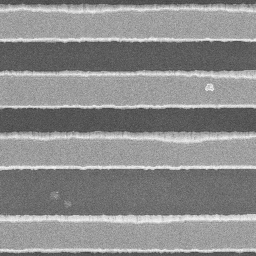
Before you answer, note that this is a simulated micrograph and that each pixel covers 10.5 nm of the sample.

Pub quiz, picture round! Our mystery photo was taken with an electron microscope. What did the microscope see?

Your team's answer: lines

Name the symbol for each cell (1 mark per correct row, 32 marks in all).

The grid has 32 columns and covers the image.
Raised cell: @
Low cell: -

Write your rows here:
--------------------------------
@@@@@@@@@@@@@@@@@@@@@@@@@@@@@@@@
@@@@@@@@@@@@@@@@@@@@@@@@@@@@@@@@
@@@@@@@@@@@@@@@@@@@@@@@@@@@@@@@@
@@@@@@@@@@@@@@@@@@@@@@@@@@@@@@@@
--------------------------------
--------------------------------
--------------------------------
--------------------------------
@@@@@@@@@@@@@@@@@@@@@@@@@@@@@@@@
@@@@@@@@@@@@@@@@@@@@@@@@@@@@@@@@
@@@@@@@@@@@@@@@@@@@@@@@@@@@@@@@@
@@@@@@@@@@@@@@@@@@@@@@@@@@@@@@@@
--------------------------------
--------------------------------
--------------------------------
--------------------------------
@@@@@@@@@@@@@@@@@@@@@@@@@@@@@@@@
@@@@@@@@@@@@@@@@@@@@@@@@@@@@@@@@
@@@@@@@@@@@@@@@@@@@@@@@@@@@@@@@@
@@@@@@@@@@@@@@@@@@@@@@@@@@@@@@@@
--------------------------------
--------------------------------
--------------------------------
--------------------------------
--------------------------------
--------------------------------
@@@@@@@@@@@@@@@@@@@@@@@@@@@@@@@@
@@@@@@@@@@@@@@@@@@@@@@@@@@@@@@@@
@@@@@@@@@@@@@@@@@@@@@@@@@@@@@@@@
@@@@@@@@@@@@@@@@@@@@@@@@@@@@@@@@
-@@----------------------@@-----